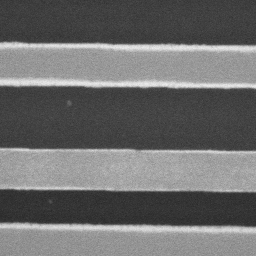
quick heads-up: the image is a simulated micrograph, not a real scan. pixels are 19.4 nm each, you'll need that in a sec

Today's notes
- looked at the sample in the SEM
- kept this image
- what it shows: lines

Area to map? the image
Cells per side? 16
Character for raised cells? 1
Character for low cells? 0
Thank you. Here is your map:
0000000000000000
0000000000000000
0000000000000000
1111111111111111
1111111111111111
0000000000000000
0000000000000000
0000000000000000
0000000000000000
1111111111111100
1111111111111111
1111111111111111
0000000000000000
0000000000000000
1111111111111111
1111111111111111